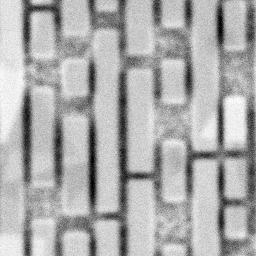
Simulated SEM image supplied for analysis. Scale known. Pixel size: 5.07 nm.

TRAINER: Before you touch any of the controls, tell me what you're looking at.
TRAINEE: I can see parallel lines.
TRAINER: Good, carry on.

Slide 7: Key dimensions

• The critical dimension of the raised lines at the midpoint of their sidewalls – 111 nm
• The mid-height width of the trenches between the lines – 0.0513 micrometres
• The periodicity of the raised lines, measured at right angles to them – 32.2 px